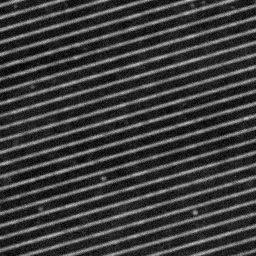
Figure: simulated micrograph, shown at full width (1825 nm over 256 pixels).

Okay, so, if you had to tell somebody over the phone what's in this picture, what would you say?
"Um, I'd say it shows parallel lines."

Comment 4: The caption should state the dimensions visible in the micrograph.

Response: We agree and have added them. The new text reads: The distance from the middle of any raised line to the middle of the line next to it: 83.8 nanometres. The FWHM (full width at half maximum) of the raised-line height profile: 15.4 nanometres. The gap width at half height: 68.5 nm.